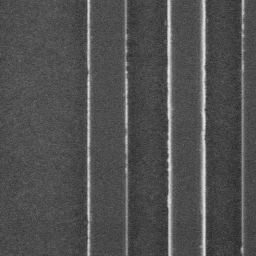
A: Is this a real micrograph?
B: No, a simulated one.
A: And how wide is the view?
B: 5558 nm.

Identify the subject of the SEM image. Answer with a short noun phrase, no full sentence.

lines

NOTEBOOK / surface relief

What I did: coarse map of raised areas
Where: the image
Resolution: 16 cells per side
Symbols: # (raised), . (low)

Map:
......##...##..#
......##...##..#
......##...##..#
......##...##..#
......##...##..#
......##...##..#
......##...##..#
......##...##..#
......##...##..#
......##...##..#
......##...##..#
......##...##..#
......##...##..#
......##...##..#
......##...##..#
......##...##..#